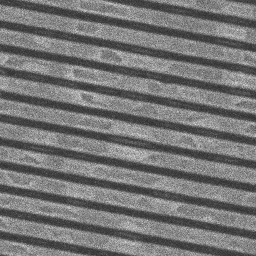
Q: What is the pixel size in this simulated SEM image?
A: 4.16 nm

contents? parallel lines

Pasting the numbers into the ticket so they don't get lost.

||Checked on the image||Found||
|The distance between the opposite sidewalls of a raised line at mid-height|60.3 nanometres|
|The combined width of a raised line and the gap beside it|0.0958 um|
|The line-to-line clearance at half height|33.8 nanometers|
